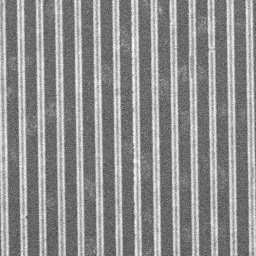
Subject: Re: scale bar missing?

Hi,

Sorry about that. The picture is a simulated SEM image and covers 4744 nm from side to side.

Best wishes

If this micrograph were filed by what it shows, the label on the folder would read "parallel lines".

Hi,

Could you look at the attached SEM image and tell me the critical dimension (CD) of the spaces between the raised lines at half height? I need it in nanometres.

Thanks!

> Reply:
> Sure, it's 273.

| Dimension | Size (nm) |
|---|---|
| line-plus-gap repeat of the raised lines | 353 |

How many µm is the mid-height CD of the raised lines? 0.0903